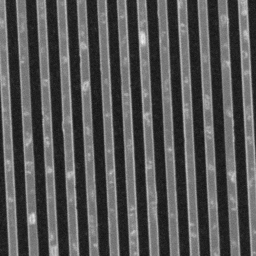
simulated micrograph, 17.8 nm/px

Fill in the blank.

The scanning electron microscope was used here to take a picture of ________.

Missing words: parallel lines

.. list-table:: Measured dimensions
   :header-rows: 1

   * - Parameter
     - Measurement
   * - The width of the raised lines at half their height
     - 0.144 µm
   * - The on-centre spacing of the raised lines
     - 0.357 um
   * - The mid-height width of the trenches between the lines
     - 206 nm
